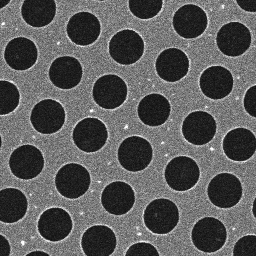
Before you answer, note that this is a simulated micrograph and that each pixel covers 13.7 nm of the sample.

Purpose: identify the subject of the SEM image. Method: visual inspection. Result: a regular array of holes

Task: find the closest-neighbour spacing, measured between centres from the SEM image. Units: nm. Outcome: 641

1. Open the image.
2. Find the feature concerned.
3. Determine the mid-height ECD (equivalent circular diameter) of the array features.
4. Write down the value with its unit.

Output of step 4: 0.476 um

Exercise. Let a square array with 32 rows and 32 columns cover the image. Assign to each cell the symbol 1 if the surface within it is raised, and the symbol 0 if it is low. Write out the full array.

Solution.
01100001111111110000111111111100
11100001110111110000110000111110
11100001100011111111110000111111
11111111000001111111110000110001
11111111100011000111111001100001
10001111110111000011111111100001
10000111111111000011000111110001
10000110001111000111000011111111
10001100001111111110000011001111
11111100001110011111000110000111
00111110001100001111111110000111
00111111111100001111111110000110
00111001111100001100011111111100
00110000111110111000011111111110
11110000111111111000011000111111
11110000110001111100111000011111
11111001100001111111111000011001
11111111100001110011111000110000
11000111110001100001111111110000
10000111111111100001111111110001
10000111001111100001100001111111
10000110000111111111100001111111
11111110000111111111100001000011
11111110000110001111100011000011
00011111001110000111111111000011
00011111111110000110001111100011
00011100111111001100001111111111
00111000011111111100001110011111
11111000011000111100001100001111
11111000110000111111111100001110
01111111110000011001111100001000
01110111110000110000111111011000